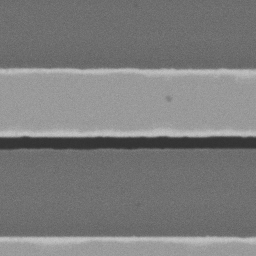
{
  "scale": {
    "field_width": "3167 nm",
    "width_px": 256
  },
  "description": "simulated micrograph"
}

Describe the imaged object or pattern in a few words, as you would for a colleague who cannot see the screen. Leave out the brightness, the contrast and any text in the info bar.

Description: lines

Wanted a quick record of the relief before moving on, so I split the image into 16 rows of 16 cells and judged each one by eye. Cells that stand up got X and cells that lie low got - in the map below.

----------------
----------------
----------------
----------------
XXXXXXXXXXXXXXXX
XXXXXXXXXXXXXXXX
XXXXXXXXXXXXXXXX
XXXXXXXXXXXXXXXX
----------------
----------------
----------------
----------------
----------------
----------------
----------------
XXXXXXXXXXXXXXXX